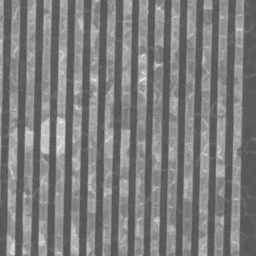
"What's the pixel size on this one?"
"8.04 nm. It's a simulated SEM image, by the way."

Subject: parallel lines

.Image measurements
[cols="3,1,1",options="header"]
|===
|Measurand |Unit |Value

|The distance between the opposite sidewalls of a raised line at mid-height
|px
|8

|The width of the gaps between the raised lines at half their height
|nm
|64.3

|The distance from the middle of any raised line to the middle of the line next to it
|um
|0.129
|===